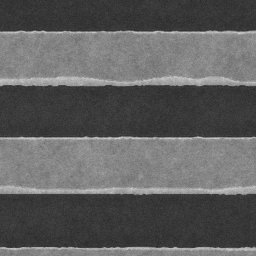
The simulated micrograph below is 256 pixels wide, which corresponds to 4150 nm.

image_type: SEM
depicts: lines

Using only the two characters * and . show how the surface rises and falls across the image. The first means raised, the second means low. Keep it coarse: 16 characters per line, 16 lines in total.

................
................
****************
****************
****************
................
................
................
................
****************
****************
****************
................
................
................
*****..*******.*